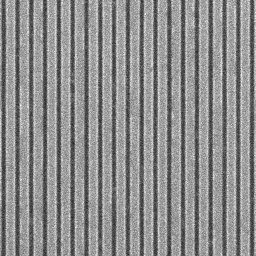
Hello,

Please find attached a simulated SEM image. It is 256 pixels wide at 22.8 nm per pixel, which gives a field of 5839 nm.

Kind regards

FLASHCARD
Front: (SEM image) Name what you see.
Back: parallel lines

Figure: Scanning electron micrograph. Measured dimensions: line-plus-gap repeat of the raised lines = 315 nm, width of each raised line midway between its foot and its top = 202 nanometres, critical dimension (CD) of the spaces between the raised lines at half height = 120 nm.